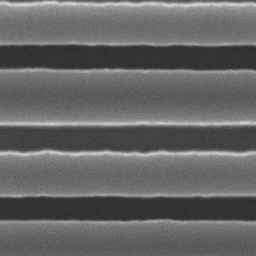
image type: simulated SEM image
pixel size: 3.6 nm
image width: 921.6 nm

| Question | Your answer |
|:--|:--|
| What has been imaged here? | lines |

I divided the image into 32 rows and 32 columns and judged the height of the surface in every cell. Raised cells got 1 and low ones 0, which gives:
11111111111111111111111111111111
11111111111111111111111111111111
11111111111111111111111111111111
11111111111111111111111111111111
11111111111111111111111111111111
00000000000101110011110111111000
00000000000000000000000000000000
00000000000000000000000000000000
00000000000000000000000000000000
11111111111111111111111111111111
11111111111111111111111111111111
11111111111111111111111111111111
11111111111111111111111111111111
11111111111111111111111111111111
11111111111111111111111111111111
11111111111111111111111111111111
00000000000000000000000000000000
00000000000000000000000000000000
00000000000000000000000000000000
11111111111111111111111111111111
11111111111111111111111111111111
11111111111111111111111111111111
11111111111111111111111111111111
11111111111111111111111111111111
11100000000000000000000000000000
00000000000000000000000000000000
00000000000000000000000000000000
00000000000000000000000000000000
11111111111111111111111111111111
11111111111111111111111111111111
11111111111111111111111111111111
11111111111111111111111111111111